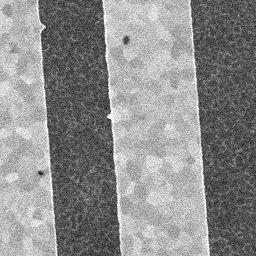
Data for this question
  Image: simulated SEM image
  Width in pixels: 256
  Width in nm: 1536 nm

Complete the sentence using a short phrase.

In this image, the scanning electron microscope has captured one or a few lines or trenches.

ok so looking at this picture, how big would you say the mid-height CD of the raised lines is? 522 nanometres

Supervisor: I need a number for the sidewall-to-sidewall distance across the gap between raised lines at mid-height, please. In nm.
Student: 391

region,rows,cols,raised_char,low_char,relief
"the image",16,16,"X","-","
XX----XXXXXX----
XXX----XXXXX----
XXX----XXXXX----
XXX----XXXXX----
XXX----XXXXX----
XXX----XXXXX----
XXX----XXXXX----
XXX----XXXXX----
XXX----XXXXXX---
XXX----XXXXXX---
XXX----XXXXXX---
XXX----XXXXXX---
XXX----XXXXXX---
XXX-----XXXXX---
XXX-----XXXXX---
XXXX----XXXXX---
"